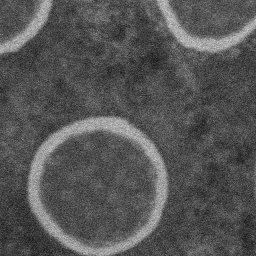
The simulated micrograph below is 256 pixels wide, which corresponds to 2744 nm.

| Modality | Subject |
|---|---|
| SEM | raised bodies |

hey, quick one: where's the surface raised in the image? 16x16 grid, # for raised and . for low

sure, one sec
###.......######
##.........#####
#...........###.
................
................
................
................
................
....#####.......
...#######......
..########......
..########......
..########......
...#######......
...######.......
.....##.........